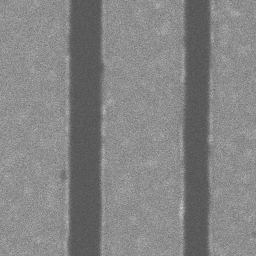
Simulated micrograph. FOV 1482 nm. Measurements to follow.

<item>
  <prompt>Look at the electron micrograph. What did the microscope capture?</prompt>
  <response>one or a few lines or trenches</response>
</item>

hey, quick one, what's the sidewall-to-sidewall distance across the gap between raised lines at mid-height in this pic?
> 0.447 micrometres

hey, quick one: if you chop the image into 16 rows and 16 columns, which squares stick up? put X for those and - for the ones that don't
----XXX----XX---
----XXX----XX---
----XXX----XX---
----XXX----XX---
----XXX----XX---
----XX-----XX---
----XXX----XX---
----XXX----XX---
----XX-----XX---
----XX-----XX---
----XX-----XX---
----XX-----XX---
----XXX----XX---
----XX-----XX---
----XX-----XX---
----XX-----XX---